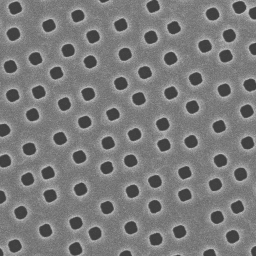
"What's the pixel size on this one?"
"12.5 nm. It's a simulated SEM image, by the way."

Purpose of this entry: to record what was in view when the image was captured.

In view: a regular array of holes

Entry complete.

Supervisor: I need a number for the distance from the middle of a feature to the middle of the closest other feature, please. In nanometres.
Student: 318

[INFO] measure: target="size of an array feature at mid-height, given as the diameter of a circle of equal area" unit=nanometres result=166